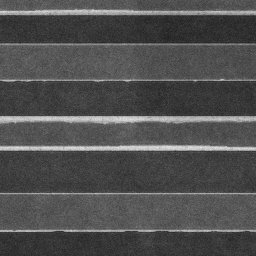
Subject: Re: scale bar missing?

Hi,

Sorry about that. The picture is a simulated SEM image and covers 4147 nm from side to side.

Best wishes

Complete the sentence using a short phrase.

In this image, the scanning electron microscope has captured lines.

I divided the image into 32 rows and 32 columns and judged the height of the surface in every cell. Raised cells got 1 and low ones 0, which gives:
11111111111111111111111111111111
11111111000000111111111111111111
00000000000000000000000000000000
00000000000000000000000000000000
00000000000000000000000000000000
00000000000000000000000000000000
11111111111111111111111111111111
11111111111111111111111111111111
11111111111111111111111111111111
11111111111111111111111111111111
00000000000000000000000000000000
00000000000000000000000000000000
00000000000000000000000000000000
00000000000000000000000000000000
00000000000000000000000000000000
11111111111111111111111111111111
11111111111111111111111111111111
11111111111111111111111111111111
11111111111111111111111111111111
00000000000000000000000000000000
00000000000000000000000000000000
00000000000000000000000000000000
00000000000000000000000000000000
00000000000000000000000000000000
11111111111111111111111111111111
11111111111111111111111111111111
11111111111111111111111111111111
11111111111111111111111111111111
11111111111111111111111111111111
00000000000000000000000000000000
00000000000000000000000000000000
00000000000000000000000000000000